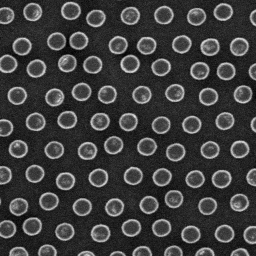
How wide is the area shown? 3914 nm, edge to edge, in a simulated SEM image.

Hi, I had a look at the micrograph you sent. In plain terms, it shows a regular array of raised bodies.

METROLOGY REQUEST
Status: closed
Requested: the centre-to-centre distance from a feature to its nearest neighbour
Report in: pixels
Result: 26.7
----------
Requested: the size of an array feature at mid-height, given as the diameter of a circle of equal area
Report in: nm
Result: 264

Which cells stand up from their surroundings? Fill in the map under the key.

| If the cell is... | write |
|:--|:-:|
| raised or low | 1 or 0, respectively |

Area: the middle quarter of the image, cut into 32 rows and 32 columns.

11100111100000011100001111000000
11000111100000011100001111000000
00000000000000000000000110000000
00000000000000000000000000000000
00000000000000000000000000000000
00011100000000000000000000011000
00111110011110000011100000111100
00111100011110000111110000111100
00011100011110000111110000111000
00000000001100000001100000000000
00000000000000000000000000000000
00000000000000000000000000000000
11000000000000000000000000000000
11100001111000111100000111000001
11100001111000111100001111000011
11000001111000111100001111000011
00000000000000011000000111000011
00000000000000000000000000000000
00000000000010000000000000000000
00000000001111000001110000000000
00001111001111100001111000011100
00001111001111000001111000111100
00001111000000000001110000111100
00000110000000000000000000111100
00000000000000000000000000000000
00000000000000000000000000000000
00000000100000001110000111000000
11000001111000011110000111100001
11100011111000011110001111100001
11100001111000001110000111000001
11000000000000000000000000000000
00000000000000000000000000000000